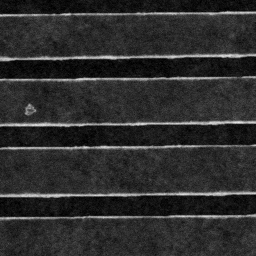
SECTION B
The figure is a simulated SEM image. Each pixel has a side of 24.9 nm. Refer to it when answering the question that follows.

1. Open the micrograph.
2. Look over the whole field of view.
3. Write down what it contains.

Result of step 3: lines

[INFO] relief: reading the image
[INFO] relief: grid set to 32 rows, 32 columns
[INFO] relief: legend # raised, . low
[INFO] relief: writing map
................................
................................
################################
################################
################################
################################
################################
................................
................................
................................
################################
################################
################################
################################
################################
################................
................................
................................
################################
################################
################################
################################
################################
################################
###.............................
................................
................................
################################
################################
################################
################################
################################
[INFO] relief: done